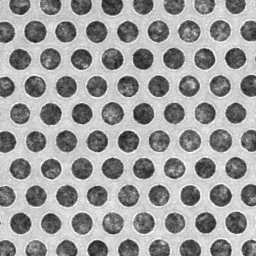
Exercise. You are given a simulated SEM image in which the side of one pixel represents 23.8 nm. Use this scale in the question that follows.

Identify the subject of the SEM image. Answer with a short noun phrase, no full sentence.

a regular array of holes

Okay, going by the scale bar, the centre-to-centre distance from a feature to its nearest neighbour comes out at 728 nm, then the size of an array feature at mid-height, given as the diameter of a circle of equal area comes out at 22.5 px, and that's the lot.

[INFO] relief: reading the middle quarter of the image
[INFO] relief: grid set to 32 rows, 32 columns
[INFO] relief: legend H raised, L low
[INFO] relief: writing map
HHLLLLLHHHLLLLHHHHLLLLHHHLLLLLHH
HHHHLHHHHHHLLHHHHHHLLHHHHHHLHHHH
HHHHHHHHHHHHHHHHHHHHHHHHHHHHHHHH
LLHHHHLLLLHHHHLLLLHHHHLLLLHHHLLL
LLLHHHLLLLLHHLLLLLLHHLLLLLHHHLLL
LLLHHLLLLLLHHLLLLLLHHLLLLLLHHLLL
LLLHHHLLLLLHHLLLLLLHHLLLLLHHHLLL
LLLHHHLLLLHHHHLLLLHHHHLLLLHHHLLL
LHHHHHHHHHHHHHHHHHHHHHHHHHHHHHHH
HHHHHHHHHHHHLHHHHHHHHHHHHHHHHHHH
HHHLLLHHHHLLLLHHHHLLLLHHHLLLLLHH
HHLLLLLHHLLLLLLHHLLLLLHHHLLLLLHH
HHLLLLLHHLLLLLLHHLLLLLLHHLLLLLHH
HHLLLLLHHLLLLLLHHLLLLLHHHLLLLLHH
HHHLLLHHHHLLLLHHHHLLLLHHHHLLLLHH
HHHHHHHHHHHHHHHHHHHHHHHHHHHHHHHH
LHHHHHHLLHHHHHHLLHHHHHHLHHHHHHLL
LLLHHHLLLLHHHHLLLLHHHHLLLLHHHLLL
LLLHHHLLLLLHHLLLLLLHHLLLLLLHHLLL
LLLHHLLLLLLHHLLLLLLHHLLLLLLHHLLL
LLLHHHLLLLLHHLLLLLLHHLLLLLHHHLLL
LLLHHHLLLLHHHHLLLLHHHHLLLHHHHHLL
HHHHHHHHHHHHHHHHHHHHHHHHHHHHHHHH
HHHLLHHHHHHLLHHHHHHLLHHHHHHLHHHH
HHLLLLLHHHLLLLLHHHLLLLHHHLLLLLHH
HHLLLLLHHLLLLLLHHLLLLLLHHLLLLLHH
HHLLLLLHHLLLLLLHHLLLLLLHHLLLLLLH
HHLLLLLHHHLLLLLHHLLLLLHHHLLLLLHH
HHHLLLHHHHHLLLHHHHLLLLHHHHLLLHHH
HHHHHHHHHHHHHHHHHHHHHHHHHHHHHHHH
LLHHHHHLLLHHHHHLLLHHHHLLLHHHHHLL
LLLHHHLLLLLHHHLLLLLHHLLLLLHHHLLL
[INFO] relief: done